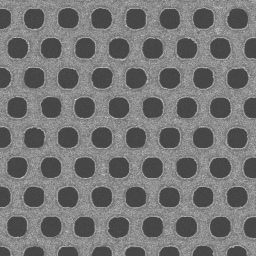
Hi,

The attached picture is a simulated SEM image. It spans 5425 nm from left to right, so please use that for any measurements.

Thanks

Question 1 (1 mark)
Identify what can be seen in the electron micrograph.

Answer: a regular array of holes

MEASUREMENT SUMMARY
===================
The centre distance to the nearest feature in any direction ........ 715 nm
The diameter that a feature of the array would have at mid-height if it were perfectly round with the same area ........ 0.452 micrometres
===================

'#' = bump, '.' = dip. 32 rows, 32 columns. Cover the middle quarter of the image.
################################
...#####...#####....#####...####
...####.....####.....###.....###
....###.....###......###.....###
....###.....###......###.....###
...#####...#####....####....####
################################
################################
####..#######..######..#######..
###....####.....####.....###....
###.....###.....####.....###....
###.....###.....####.....###....
###....####.....####....####....
####..#######.#######..#######.#
################################
################################
...#####...#####....#####...####
...####.....####.....###.....###
....###.....###......###.....###
....###.....####.....###.....###
...#####...#####....#####...####
################################
################################
####...#####...######..######...
###.....###.....####.....###....
###.....###.....###......###....
###.....###.....###......###....
###....####.....####.....###....
#####.#######.#######..#######.#
################################
################################
...####.....####....####....####